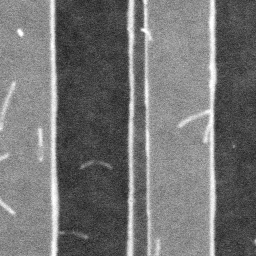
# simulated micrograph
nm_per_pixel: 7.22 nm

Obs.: lines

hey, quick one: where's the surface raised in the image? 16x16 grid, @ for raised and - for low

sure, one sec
@@@------@@@@---
@@@------@@@@---
@@@------@@@@---
@@@------@@@@---
@@@------@@@@---
@@@------@@@@---
@@@------@@@@---
@@@------@@@@---
@@@------@@@@---
@@@------@@@@---
@@@------@@@@---
@@@------@@@@---
@@@------@@@@---
@@@------@@@@---
@@@------@@@@---
@@@------@@@@---